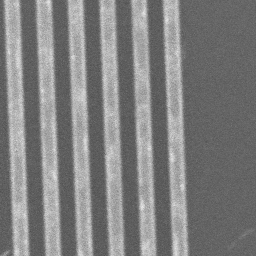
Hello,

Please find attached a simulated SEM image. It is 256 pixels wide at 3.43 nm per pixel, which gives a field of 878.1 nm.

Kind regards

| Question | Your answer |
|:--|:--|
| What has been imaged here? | parallel lines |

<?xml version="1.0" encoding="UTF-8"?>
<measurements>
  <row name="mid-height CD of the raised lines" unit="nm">42.5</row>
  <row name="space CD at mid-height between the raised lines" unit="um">0.0665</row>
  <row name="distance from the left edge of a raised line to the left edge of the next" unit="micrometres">0.109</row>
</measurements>